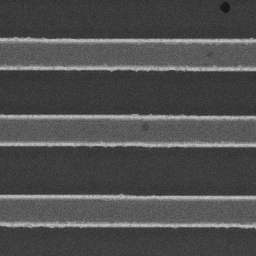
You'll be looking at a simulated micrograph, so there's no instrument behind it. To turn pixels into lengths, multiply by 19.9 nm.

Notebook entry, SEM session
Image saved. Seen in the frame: lines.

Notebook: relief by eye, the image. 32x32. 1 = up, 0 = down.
00000000000000000000000000000000
00000000000000000000000000000000
00000000000000000000000000000000
00000000000000000000000000000000
00000000000000000000000000000000
11111111111111111111111111111111
11111111111111111111111111111111
11111111111111111111111111111111
11111111111111111111111111111111
00000000000000000000000000000000
00000000000000000000000000000000
00000000000000000000000000000000
00000000000000000000000000000000
00000000000000000000000000000000
11111111111111111100100000000000
11111111111111111111111111111111
11111111111111111111111111111111
11111111111111111111111111111111
00000000000000000000000000000000
00000000000000000000000000000000
00000000000000000000000000000000
00000000000000000000000000000000
00000000000000000000000000000000
00000000000000000000000000000000
11111111111111110000000000000000
11111111111111111111111111111111
11111111111111111111111111111111
11111111111111111111111111111111
00000000000000000000000000000000
00000000000000000000000000000000
00000000000000000000000000000000
00000000000000000000000000000000